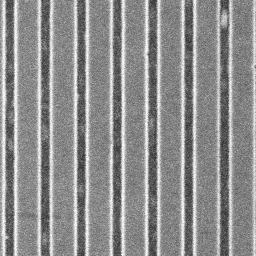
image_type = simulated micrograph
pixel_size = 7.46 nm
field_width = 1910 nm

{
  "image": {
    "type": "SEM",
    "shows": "parallel lines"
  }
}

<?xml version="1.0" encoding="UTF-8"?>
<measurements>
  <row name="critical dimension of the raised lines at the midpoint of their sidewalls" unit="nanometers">182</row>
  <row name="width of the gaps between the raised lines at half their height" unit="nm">87.7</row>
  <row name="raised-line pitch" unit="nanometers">268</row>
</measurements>